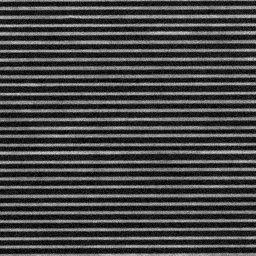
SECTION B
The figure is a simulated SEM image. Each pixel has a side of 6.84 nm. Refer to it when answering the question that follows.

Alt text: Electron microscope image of parallel lines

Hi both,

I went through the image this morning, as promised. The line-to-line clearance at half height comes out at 41.9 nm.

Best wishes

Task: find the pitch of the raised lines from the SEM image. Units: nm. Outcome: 58.3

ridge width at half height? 18 nm